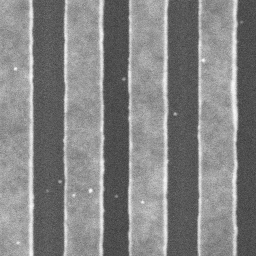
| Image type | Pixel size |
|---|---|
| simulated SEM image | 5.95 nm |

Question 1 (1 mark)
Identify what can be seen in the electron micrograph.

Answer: lines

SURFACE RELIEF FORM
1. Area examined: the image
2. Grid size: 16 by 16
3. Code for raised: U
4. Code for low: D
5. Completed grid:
UUDDUUDDUUDDUUUD
UUDDUUDDUUDDUUUD
UUDDUUDDUUDDUUUD
UUDDUUDDUUDDUUUD
UUDDUUDDUUDDUUUD
UUDDUUDDUUDDUUUD
UUDDUUDDUUDDUUUD
UUDDUUDDUUDDUUUD
UUDDUUDDUUDDUUUD
UUDDUUDDUUDDUUUD
UUDDUUDDUUDDUUUD
UUDDUUDDUUDDUUUD
UUDDUUDDUUDDUUUD
UUDDUUDDUUDDUUUD
UUDDUUDDUUDDUUUD
UUDDUUDDUUDDUUUD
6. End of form